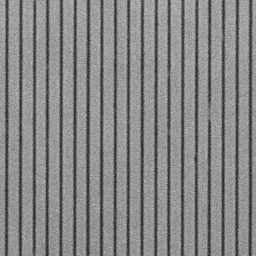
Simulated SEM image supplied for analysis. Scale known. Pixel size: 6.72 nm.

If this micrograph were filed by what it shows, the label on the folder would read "parallel lines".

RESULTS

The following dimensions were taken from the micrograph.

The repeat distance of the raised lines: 91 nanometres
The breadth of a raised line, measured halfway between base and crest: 73.9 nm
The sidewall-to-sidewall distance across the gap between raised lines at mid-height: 18.5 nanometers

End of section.